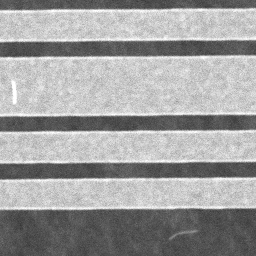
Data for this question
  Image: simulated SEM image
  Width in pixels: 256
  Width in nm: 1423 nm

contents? wiring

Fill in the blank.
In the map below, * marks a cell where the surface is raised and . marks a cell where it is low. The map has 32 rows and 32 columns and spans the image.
................................
********************************
********************************
********************************
********************************
................................
................................
********************************
********************************
********************************
********************************
********************************
********************************
********************************
................................
................................
..........**********************
********************************
********************************
********************************
................................
................................
.....***************************
********************************
********************************
********************************
................................
................................
................................
................................
................................
................................